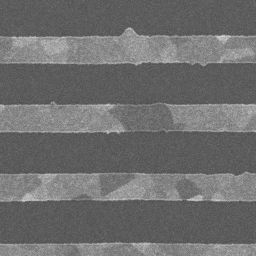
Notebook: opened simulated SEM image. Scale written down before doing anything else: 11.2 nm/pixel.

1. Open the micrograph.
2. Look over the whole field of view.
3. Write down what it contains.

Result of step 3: one or a few lines or trenches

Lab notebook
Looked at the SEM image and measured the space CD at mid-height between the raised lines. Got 43 px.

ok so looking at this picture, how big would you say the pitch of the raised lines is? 766 nm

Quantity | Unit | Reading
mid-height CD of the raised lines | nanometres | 287